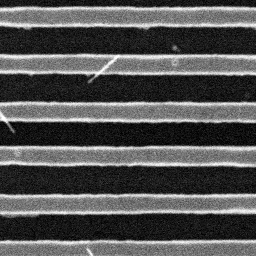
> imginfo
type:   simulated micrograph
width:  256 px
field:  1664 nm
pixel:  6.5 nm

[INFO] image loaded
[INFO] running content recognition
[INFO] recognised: lines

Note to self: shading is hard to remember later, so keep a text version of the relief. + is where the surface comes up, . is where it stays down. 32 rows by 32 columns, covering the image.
................................
++++++++++++++++++++++++++++++++
++++++++++++++++++++++++++++++++
................................
................................
................................
................................
++++++++++++++++++++++++++++++++
++++++++++++++++++++++++++++++++
................................
................................
................................
................................
++++++++++++++++++++++++++++++++
++++++++++++++++++++++++++++++++
................................
................................
................................
++++++++++++++++++++++++++++++++
++++++++++++++++++++++++++++++++
+.++++++++++++++++++++++++++++++
................................
................................
................................
++++++++++++++++++++++++++++++++
++++++++++++++++++++++++++++++++
++++++++++++++++++++++++++++++++
................................
................................
................................
++++++++++++++++++++++++++++++++
++++++++++++++++++++++++++++++++